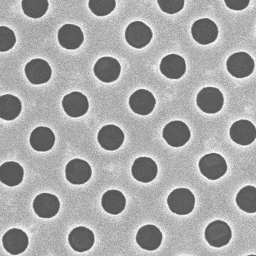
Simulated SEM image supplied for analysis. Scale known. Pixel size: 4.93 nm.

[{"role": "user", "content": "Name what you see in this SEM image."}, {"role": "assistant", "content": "a regular array of holes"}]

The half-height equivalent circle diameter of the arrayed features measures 131 nanometers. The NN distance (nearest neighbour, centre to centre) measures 232 nanometres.